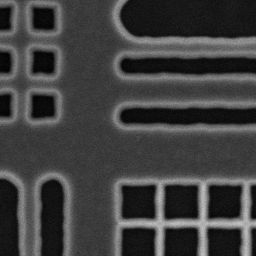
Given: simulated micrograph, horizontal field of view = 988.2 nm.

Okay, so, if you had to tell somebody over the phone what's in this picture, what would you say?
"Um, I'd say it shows groups of lines, slits or small figures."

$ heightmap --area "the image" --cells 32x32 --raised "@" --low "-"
@@@@@@@@@@@@@@@-----------------
--@@---@@@@@@@@-----------------
--@@---@@@@@@@@-----------------
--@@---@@@@@@@@-----------------
@@@@@@@@@@@@@@@@----------------
@@@@@@@@@@@@@@@@@@@@@@@@@@@@@@@@
-@@@---@@@@@@@@@@@@@@@@@@@@@@@@@
--@@---@@@@@@@@-----------------
--@@---@@@@@@@@-----------------
@@@@@@@@@@@@@@@@@@@@@@@@-@@@@@@@
@@@@@@@@@@@@@@@@@@@@@@@@@@@@@@@@
@@@@@@@@@@@@@@@@@@@@@@@@@@@@@@@@
--@@---@@@@@@@@@@@@@@@@@@@@@@@@@
--@@---@@@@@@@@-----------------
--@@---@@@@@@@@-----------------
@@@@@@@@@@@@@@@-----------------
@@@@@@@@@@@@@@@@@@@@@@@@@@@@@@@@
@@@@@@@@@@@@@@@@@@@@@@@@@@@@@@@@
@@@@@@@@@@@@@@@@@@@@@@@@@@@@@@@@
@@@@@@@@@@@@@@@@@@@@@@@@@@@@@@@@
@@@@@@@@@@@@@@@@@@@@@@@@@@@@@@@@
@@@@@@@@@@@@@@@@@@@@@@@@@@@@@@@@
--@@@@-@@@@@@@@@@@@@@@@@@@@@@@@@
--@@@---@@@@@@@----------@----@-
---@@---@@@@@@@----------@----@-
--@@@---@@@@@@@----------@----@-
--@@@---@@@@@@@----------@----@-
---@@---@@@@@@@----@@----@----@-
---@@---@@@@@@@----@@----@----@-
---@@---@@@@@@@----------@----@-
---@@---@@@@@@@----------@----@-
---@@---@@@@@@@----------@----@-